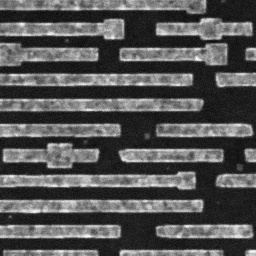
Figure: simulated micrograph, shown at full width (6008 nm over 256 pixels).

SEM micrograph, wiring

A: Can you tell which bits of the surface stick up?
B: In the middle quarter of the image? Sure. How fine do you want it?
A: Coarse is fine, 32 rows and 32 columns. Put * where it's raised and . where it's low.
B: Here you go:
................................
................................
................................
********************************
********************************
................................
................................
................................
................................
********************************
********************************
********************************
................................
................................
................................
**************.........*********
**************.........*********
**************.........*********
................................
................................
**..............................
********.......*****************
*********.....******************
********......******************
***.............................
**..............................
................................
............................****
********************************
********************************
*..........**********.......****
................................